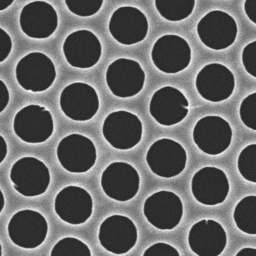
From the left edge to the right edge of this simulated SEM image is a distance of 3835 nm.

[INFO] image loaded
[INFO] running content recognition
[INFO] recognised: a regular array of holes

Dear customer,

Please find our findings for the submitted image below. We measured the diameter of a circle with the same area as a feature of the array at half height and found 583 nanometres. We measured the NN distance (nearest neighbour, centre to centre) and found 772 nanometers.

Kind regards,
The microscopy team